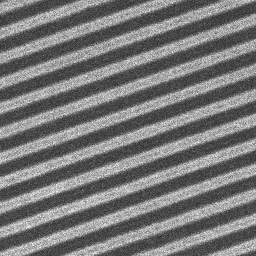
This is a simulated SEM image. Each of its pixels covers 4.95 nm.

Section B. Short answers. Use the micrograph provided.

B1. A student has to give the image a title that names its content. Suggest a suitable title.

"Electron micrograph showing parallel lines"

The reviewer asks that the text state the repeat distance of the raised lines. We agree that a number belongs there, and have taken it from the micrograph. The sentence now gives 116 nm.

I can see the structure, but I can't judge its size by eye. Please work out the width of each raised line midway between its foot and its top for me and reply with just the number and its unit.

0.059 microns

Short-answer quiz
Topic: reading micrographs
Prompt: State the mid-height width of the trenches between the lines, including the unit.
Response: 58.4 nm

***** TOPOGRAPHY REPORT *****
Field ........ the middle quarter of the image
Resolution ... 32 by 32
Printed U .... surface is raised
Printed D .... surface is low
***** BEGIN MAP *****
UDDDDDDDDDUUUUUUUUUDDDDDDDDDUUUU
DDDDDDDUUUUUUUUUDDDDDDDDDUUUUUUU
DDDDUUUUUUUUUDDDDDDDDDUUUUUUUUUU
DDUUUUUUUUUDDDDDDDDUUUUUUUUUUDDD
UUUUUUUUDDDDDDDDUUUUUUUUUUDDDDDD
UUUUUDDDDDDDDDUUUUUUUUUDDDDDDDDU
UUDDDDDDDDUUUUUUUUUUDDDDDDDDUUUU
DDDDDDDDUUUUUUUUUDDDDDDDDDUUUUUU
DDDDDUUUUUUUUUDDDDDDDDDUUUUUUUUU
DDUUUUUUUUUDDDDDDDDDUUUUUUUUUDDD
UUUUUUUUDDDDDDDDDUUUUUUUUUDDDDDD
UUUUUDDDDDDDDDUUUUUUUUUDDDDDDDDD
UUDDDDDDDDDUUUUUUUUUDDDDDDDDDUUU
DDDDDDDDUUUUUUUUUDDDDDDDDDUUUUUU
DDDDDUUUUUUUUUDDDDDDDDDDUUUUUUUU
DDDUUUUUUUUUDDDDDDDDDUUUUUUUUUDD
UUUUUUUUUDDDDDDDDDUUUUUUUUUDDDDD
UUUUUUDDDDDDDDUUUUUUUUUUDDDDDDDD
UUUUDDDDDDDDUUUUUUUUUDDDDDDDDUUU
UDDDDDDDDUUUUUUUUUDDDDDDDDDUUUUU
DDDDDDUUUUUUUUUDDDDDDDDDUUUUUUUU
DDDUUUUUUUUUDDDDDDDDDUUUUUUUUUDD
DUUUUUUUUUDDDDDDDDUUUUUUUUUUDDDD
UUUUUUUDDDDDDDDUUUUUUUUUUDDDDDDD
UUUUDDDDDDDDUUUUUUUUUUDDDDDDDDUU
UDDDDDDDDUUUUUUUUUUDDDDDDDDUUUUU
DDDDDDDUUUUUUUUUDDDDDDDDDUUUUUUU
DDDDUUUUUUUUUDDDDDDDDDUUUUUUUUUD
DUUUUUUUUUDDDDDDDDDUUUUUUUUUDDDD
UUUUUUUDDDDDDDDDDUUUUUUUUUDDDDDD
UUUUDDDDDDDDDDUUUUUUUUUDDDDDDDDU
UDDDDDDDDDDUUUUUUUUUDDDDDDDDUUUU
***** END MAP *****